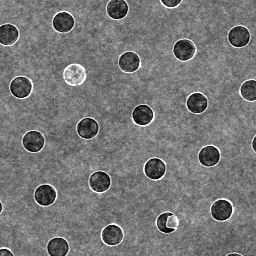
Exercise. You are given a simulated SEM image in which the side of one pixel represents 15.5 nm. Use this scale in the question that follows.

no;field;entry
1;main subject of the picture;a regular array of holes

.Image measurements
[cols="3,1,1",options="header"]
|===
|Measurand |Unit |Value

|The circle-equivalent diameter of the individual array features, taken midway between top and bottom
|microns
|0.326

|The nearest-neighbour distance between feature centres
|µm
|0.851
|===